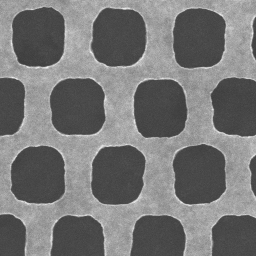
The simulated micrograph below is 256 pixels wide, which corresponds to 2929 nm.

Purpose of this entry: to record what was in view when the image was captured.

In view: a regular array of holes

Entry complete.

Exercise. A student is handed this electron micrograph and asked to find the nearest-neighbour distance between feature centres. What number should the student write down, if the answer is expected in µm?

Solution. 0.903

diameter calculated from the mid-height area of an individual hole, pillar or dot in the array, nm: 678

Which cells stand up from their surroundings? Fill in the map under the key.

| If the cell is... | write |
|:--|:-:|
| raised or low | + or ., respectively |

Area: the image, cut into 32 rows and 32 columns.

++++++++++++++++++++++++++++++++
+++....++++++....++++++....+++++
++......++++......++++......++++
++......++++......++++......++++
++......+++.......++++......++++
++......+++.......++++......+++.
++......++++......++++......++++
++.....+++++.....+++++......++++
+++++++++++++++++++++++..+++++++
++++++++++++++++++++++++++++++++
...++++.....+++++.....+++++.....
...+++.......++++......++++.....
...+++.......++++......+++......
...+++.......++++......++++.....
...+++.......++++......++++.....
...++++......++++......++++.....
..+++++.....+++++......++++.....
++++++++++++++++++++++++++++++++
+++....++++++....++++++....+++++
++......++++......++++......++++
+.......++++......++++......+++.
+.......+++.......++++......+++.
+.......+++.......++++......+++.
+.......+++.......++++......+++.
++......++++.....+++++......++++
+++++++++++++...+++++++..+++++++
++++++++++++++++++++++++++++++++
..+++++.....+++++.....+++++.....
...++++......++++......++++.....
...++++......++++......+++......
...+++.......+++.......+++......
...+++.......+++.......+++......